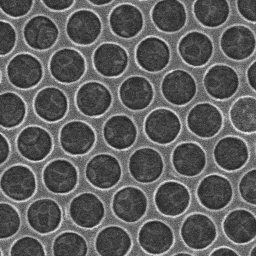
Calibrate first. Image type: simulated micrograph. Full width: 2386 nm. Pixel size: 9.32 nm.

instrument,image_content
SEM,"a regular array of holes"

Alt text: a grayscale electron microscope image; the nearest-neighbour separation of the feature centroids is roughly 390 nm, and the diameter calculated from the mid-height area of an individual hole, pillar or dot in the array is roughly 323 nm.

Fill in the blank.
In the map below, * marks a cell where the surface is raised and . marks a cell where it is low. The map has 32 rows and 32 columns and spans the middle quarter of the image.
.....***........***......*******
.....***.......*****....****.***
.....****.....************.....*
....************....*****.......
...***..*******......****.......
****......****........**........
****.......***........**........
***.........**........***.......
.**.........**........***.......
.**.........**........****.....*
.**.........***......***********
.***.......******.*****...******
*****.....***********.......***.
***********.....*****........**.
*...******.......***.........**.
......****........**.........**.
.......***........**.........***
........**........***........***
........**........***.......****
........***.......****.....*****
.......****......***********....
......************.....*****....
**...****.*******.......***.....
*******......****.......***.....
.*****........**.........**.....
..****........**.........**.....
...**.........**.........***....
...**.........***.......*****...
...***........***.......********
...***........*****...****..****
...****......***********......**
..************.....****........*